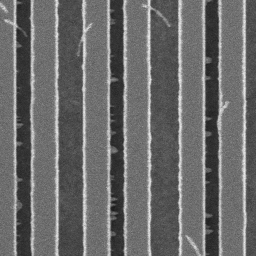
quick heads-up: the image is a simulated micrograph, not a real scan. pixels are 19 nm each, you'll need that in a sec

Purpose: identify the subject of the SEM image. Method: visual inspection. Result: lines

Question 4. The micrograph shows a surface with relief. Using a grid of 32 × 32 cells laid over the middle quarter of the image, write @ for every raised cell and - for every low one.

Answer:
-----@@@@@@----@@@@@@@-------@@@
-----@@@@@@@---@@@@@@--------@@@
-----@@@@@@@---@@@@@@@-------@@@
-----@@@@@@@---@@@@@@@-------@@@
-----@@@@@@@---@@@@@@@-------@@@
-----@@@@@@----@@@@@@--------@@@
-----@@@@@@----@@@@@@--------@@@
-----@@@@@@----@@@@@@@-------@@@
-----@@@@@@----@@@@@@--------@@@
-----@@@@@@----@@@@@@--------@@@
-----@@@@@@----@@@@@@--------@@@
-----@@@@@@----@@@@@@--------@@@
-----@@@@@@----@@@@@@--------@@@
-----@@@@@@----@@@@@@--------@@@
-----@@@@@@----@@@@@@--------@@@
-----@@@@@@----@@@@@@--------@@@
-----@@@@@@@---@@@@@@--------@@@
-----@@@@@@@---@@@@@@@-------@@@
-----@@@@@@@---@@@@@@@-------@@@
-----@@@@@@----@@@@@@@-------@@@
-----@@@@@@@---@@@@@@--------@@@
-----@@@@@@@---@@@@@@--------@@@
-----@@@@@@@---@@@@@@@-------@@@
-----@@@@@@@---@@@@@@@-------@@@
-----@@@@@@@---@@@@@@@-------@@@
-----@@@@@@@---@@@@@@@-------@@@
-----@@@@@@@---@@@@@@@-------@@@
-----@@@@@@----@@@@@@--------@@@
-----@@@@@@----@@@@@@@-------@@@
-----@@@@@@@---@@@@@@@-------@@@
-----@@@@@@@---@@@@@@@-------@@@
-----@@@@@@@---@@@@@@--------@@@